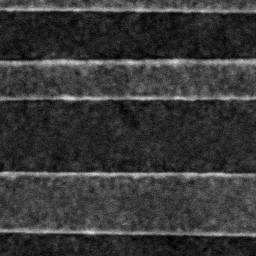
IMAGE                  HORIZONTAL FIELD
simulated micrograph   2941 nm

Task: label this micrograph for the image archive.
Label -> lines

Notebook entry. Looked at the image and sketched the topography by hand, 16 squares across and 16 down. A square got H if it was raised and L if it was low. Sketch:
HHHHHHHHHHHHHHHH
LLLLLLLLLLLLLLLL
LLLLLLLLLLLLLLLL
LLLLLLLLLLLLLLLL
HHHHHHHHHHHHHHHH
HHHHHHHHHHHHHHHH
LLLLLLLLLLLLLLLL
LLLLLLLLLLLLLLLL
LLLLLLLLLLLLLLLL
LLLLLLLLLLLLLLLL
LLLLLLLLLLLLLLLL
HHHHHHHHHHHHHHHH
HHHHHHHHHHHHHHHH
HHHHHHHHHHHHHHHH
LLLHHHHHHHHHHHHH
LLLLLLLLLLLLLLLL